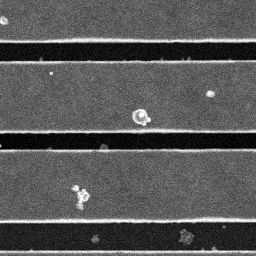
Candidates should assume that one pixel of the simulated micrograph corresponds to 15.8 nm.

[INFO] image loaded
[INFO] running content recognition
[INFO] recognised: lines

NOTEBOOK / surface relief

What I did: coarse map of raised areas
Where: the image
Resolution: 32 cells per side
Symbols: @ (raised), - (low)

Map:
@@@@@@@@@@@@@@@@@@@@@@@@@@@@@@@@
@@@@@@@@@@@@@@@@@@@@@@@@@@@@@@@@
@@@@@@@@@@@@@@@@@@@@@@@@@@@@@@@@
@@@@@@@@@@@@@@@@@@@@@@@@@@@@@@@@
@@@@@@@@@@@@@@@@@@@@@@@@@@@@@@@@
--------------------------------
--------------------------------
--------------------------------
@@@@@@@@@@@@@@@@@@@@@@@@@@@@@@@@
@@@@@@@@@@@@@@@@@@@@@@@@@@@@@@@@
@@@@@@@@@@@@@@@@@@@@@@@@@@@@@@@@
@@@@@@@@@@@@@@@@@@@@@@@@@@@@@@@@
@@@@@@@@@@@@@@@@@@@@@@@@@@@@@@@@
@@@@@@@@@@@@@@@@@@@@@@@@@@@@@@@@
@@@@@@@@@@@@@@@@@@@@@@@@@@@@@@@@
@@@@@@@@@@@@@@@@@@@@@@@@@@@@@@@@
@@@@@@@@@@@@@@@@@@@@@@@@@@@@@@@@
--------------------------------
--------------------------------
@@@@@@@@@@@@@@@@@@@@@@@@@@@@@@@@
@@@@@@@@@@@@@@@@@@@@@@@@@@@@@@@@
@@@@@@@@@@@@@@@@@@@@@@@@@@@@@@@@
@@@@@@@@@@@@@@@@@@@@@@@@@@@@@@@@
@@@@@@@@@@@@@@@@@@@@@@@@@@@@@@@@
@@@@@@@@@@@@@@@@@@@@@@@@@@@@@@@@
@@@@@@@@@@@@@@@@@@@@@@@@@@@@@@@@
@@@@@@@@@@@@@@@@@@@@@@@@@@@@@@@@
@@@@@@@@@@@@@@@@@@@@@@@@@@@@@@@@
--------------------------------
--------------------------------
--------------------------------
@@@@@@@@@@@@@@@@@@@@@@@@@@@@@@@@